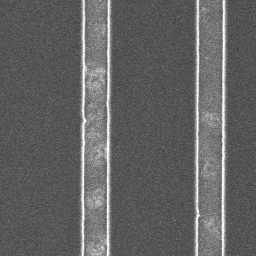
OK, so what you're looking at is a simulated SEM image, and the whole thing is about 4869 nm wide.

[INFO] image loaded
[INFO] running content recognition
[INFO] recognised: one or a few lines or trenches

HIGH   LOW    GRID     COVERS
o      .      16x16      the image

ooooo..ooooo..oo
ooooo..ooooo..oo
ooooo..ooooo..oo
ooooo..ooooo..oo
ooooo..ooooo..oo
ooooo..ooooo..oo
ooooo..ooooo..oo
ooooo..ooooo..oo
ooooo..ooooo..oo
ooooo..ooooo..oo
ooooo..ooooo..oo
ooooo..ooooo..oo
ooooo..ooooo..oo
ooooo..ooooo..oo
ooooo..ooooo..oo
ooooo..ooooo..oo